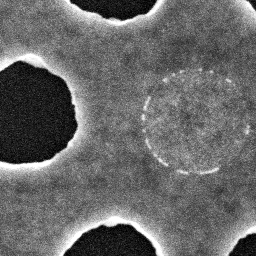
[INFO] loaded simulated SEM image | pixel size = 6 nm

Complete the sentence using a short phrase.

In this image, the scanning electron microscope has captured holes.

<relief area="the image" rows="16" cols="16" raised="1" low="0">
1111100000111111
1111111111111111
1111111111111111
1111111111111111
0001111111111111
0000111111111111
0000011111111111
0000011111111111
0000011111111111
0000111111111111
1111111111111111
1111111111111111
1111111111111111
1111111111111111
1111100001111111
1111000000111110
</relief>